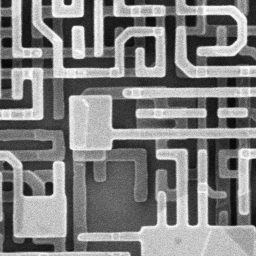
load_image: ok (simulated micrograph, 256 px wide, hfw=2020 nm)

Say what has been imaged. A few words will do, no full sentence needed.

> wiring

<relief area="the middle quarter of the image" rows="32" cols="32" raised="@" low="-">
-------------@@---@@--@@@---@@@@
@@@@@@@@@@@@@@@@@@@@@@@@@----@@@
@@@@@@@@@@@@@@@@@@@@@@@@@-----@@
--------------------------------
--------------------------------
--------------------------------
-----@@@@@@@@@@@@@@@@@@@@@@@@@@@
----@@@@@@@@@@@@@@@@@@@@@@@@@@@@
-@@@@@@@@@@@@@@@@@@@@@@@@@------
-@@@@@@@@@@@----------@@@@------
--@@@@@@@@@@-----------@@@------
--@@@@@@@@@@------@@@@@@@@@@@@@@
--@@@@@@@@@@------@@@@@@@@@@@@@@
--@@@@@@@@@@-----------@@@@@@@@-
--@@@@@@@@@@----------------@@@-
--@@@@@@@@@@----------------@@@-
--@@@@@@@@@@@---@@@@@@@@@@@@@@@@
--@@@@@@@@@@@@@@@@@@@@@@@@@@@@@@
--@@@@@@@@@@@@@@@@@@@@@@@@@@@@@-
--@@@@@@@@@@-----------@@@------
--@@@@@@@@@@-----------@@@------
--@@@@@@@@@------------@@@@@@@@-
---@@@@@@@-------------@@@@@@@@-
---@@@@@@@-------------@@@@@@@@-
----------------------------@@@-
----------------------------@@@-
-----------------------@@---@@@-
-----------------------@@@--@@@-
-----------------------@@@--@@@-
-----------------------@@@--@@@-
-----------------------@@@--@@@-
-----------------------@@@@@@@@-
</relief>